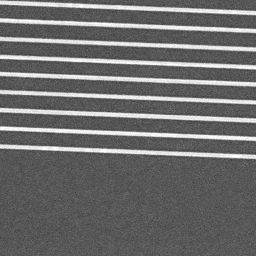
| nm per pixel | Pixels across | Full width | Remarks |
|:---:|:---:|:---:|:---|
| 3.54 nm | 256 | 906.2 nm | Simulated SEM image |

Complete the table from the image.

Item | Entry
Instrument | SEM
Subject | parallel lines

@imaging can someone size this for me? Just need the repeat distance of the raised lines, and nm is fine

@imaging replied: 63.7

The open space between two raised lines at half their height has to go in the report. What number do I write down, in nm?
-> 52.2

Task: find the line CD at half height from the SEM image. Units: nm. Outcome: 10.6